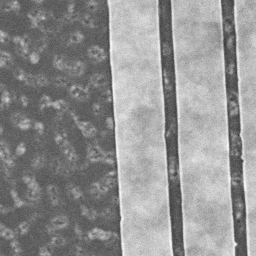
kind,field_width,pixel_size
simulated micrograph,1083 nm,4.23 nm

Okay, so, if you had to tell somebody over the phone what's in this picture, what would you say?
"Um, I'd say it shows one or a few lines or trenches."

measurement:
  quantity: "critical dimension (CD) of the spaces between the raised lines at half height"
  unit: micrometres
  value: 0.0575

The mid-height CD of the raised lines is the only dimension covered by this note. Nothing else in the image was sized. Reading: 0.206 microns